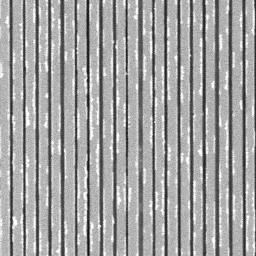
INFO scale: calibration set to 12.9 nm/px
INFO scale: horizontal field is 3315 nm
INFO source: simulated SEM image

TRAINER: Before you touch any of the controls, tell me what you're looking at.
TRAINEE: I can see parallel lines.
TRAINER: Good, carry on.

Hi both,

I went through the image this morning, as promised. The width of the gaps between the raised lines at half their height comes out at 45.3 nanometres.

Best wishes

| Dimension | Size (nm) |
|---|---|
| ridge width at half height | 126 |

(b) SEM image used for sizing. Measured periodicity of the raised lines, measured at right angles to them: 167 nm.